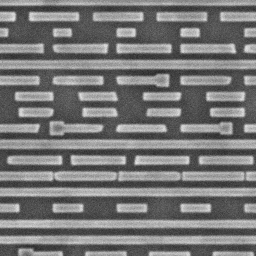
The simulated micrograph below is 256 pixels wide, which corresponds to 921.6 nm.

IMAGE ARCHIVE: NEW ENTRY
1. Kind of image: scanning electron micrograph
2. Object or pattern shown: wiring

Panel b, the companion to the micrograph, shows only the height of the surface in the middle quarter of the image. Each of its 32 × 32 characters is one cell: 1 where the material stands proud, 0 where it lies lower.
11111111111111111111111111111111
00000000000000000000000000000000
00000000000000000000000000000000
11111111110001111111111111000111
11111111110000111111111111000111
00000000000000000000000000000000
00000000000000000000000000000000
00001111111110000000111111111000
00001111111110000000111111111000
00000000000000000000000000000000
00000000000000000000000000000000
00000111111110000000001111111000
00000111111110000000011111111000
00000000000000000000000000000000
00000000000000000000000000000000
11111111100000111111111110000111
11111111100001111111111110000111
00000000000000000000000000000000
00000000000000000000000000000000
11111111111111111111111111111111
11111111111111111111111111111111
00000000000000000000000000000000
00000000000000000000000000000000
00111111111111100011111111111110
00111111111111100011111111111110
00000000000000000000000000000000
00000000000000000000000000000000
11111111111110111111111111111011
11111111111110111111111111111111
00000000000000000000000000000000
00000000000000000000000000000000
11111111111111111111111111111111